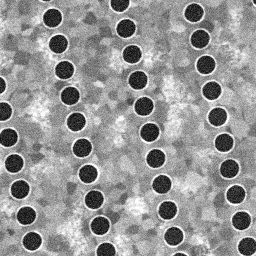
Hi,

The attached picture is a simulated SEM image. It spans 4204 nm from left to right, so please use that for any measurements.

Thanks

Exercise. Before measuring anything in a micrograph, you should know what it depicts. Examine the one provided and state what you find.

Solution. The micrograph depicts a regular array of holes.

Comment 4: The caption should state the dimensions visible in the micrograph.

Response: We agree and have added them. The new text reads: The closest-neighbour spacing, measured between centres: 437 nanometers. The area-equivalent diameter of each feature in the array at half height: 20 pixels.